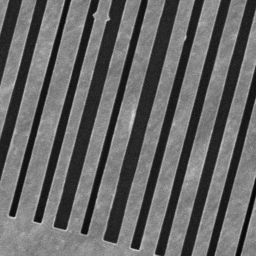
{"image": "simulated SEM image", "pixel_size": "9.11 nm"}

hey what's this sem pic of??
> parallel lines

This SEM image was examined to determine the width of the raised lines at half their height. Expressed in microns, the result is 0.14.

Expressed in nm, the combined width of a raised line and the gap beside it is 231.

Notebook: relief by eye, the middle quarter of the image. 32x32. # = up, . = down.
##...###...####..####....###...#
##..###....####..####....###...#
##..###....###..####....####..##
##..###....###..####....####..##
#...###...####..####....###...##
#..###....####..####....###...##
#..###....###..####....####..###
#..###....###..####....####..###
...###...####..####....###...###
..###....####..####...####..####
..###....###..####....####..####
..###...####..####....####..####
.####...####..####....###...####
.###....####.#####...####..####.
.###....###..#####...####..####.
.###...####..####....###...####.
####...####..####...####...####.
###....###..#####...####..####..
###....###..####....####..####..
###...####..####....###...####..
##....####..####....###...####..
##....###..####....####..####...
##....###..####....####..####...
##...####..####....###...####..#
#....####..####....###...####..#
#....###..####....####..####...#
#....###..####....####..####...#
#...####..####....###...####...#
....####..####....###...####..##
....###..#####...####..####...##
....###..####....####..####...##
...####..####....###...####..###